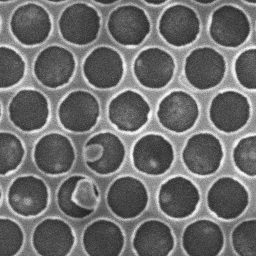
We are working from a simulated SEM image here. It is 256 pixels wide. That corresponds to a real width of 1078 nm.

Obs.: a regular array of holes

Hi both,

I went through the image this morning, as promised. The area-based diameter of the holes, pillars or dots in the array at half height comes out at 175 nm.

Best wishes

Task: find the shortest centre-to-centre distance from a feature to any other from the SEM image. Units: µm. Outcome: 0.206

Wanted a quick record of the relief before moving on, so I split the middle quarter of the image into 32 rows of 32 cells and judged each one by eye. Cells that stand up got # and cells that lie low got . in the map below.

...##..........##...........##..
...##..........##...........##..
..###..........###..........##..
..###..........###.........##...
.#####........#####.......###...
########.....######.......#####.
###.############.###############
#......#######.....#######.....#
........####........#####.......
.........###.........###........
.........##..........###........
.........##...........##........
.........##..........##.........
........###..........##.........
........####.........###........
.......######.......####........
#.....########....########.....#
#########....########.##########
.######.......#####......######.
..####........####.........####.
..###..........##..........###..
...##.###......##..........###..
...######......##...........#...
...#####.......##...........#...
..###..........##..........###..
..####........####.........###..
.######......#####........#####.
########...##########....#######
#....#########....#########...##
....########.......#######......
...####.####........####........
...####.###..........###........